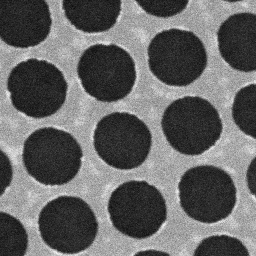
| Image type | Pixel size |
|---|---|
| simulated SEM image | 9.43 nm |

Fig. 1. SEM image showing a regular array of holes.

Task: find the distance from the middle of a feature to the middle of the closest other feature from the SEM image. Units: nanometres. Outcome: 658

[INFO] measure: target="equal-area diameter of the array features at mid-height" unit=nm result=559